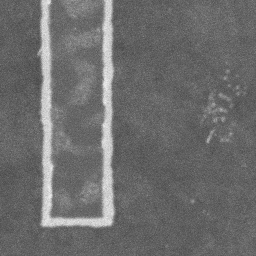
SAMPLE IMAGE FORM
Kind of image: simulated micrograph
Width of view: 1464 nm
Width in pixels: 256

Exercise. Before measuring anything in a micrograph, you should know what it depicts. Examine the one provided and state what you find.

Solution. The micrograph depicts one or a few lines or trenches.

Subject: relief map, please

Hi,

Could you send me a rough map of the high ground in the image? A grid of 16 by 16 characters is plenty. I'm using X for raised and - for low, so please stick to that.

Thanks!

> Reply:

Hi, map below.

---XXXX---------
---XXXX---------
---XXXX---------
---XXXX---------
---XXXX---------
---XXXX---------
---XXXX---------
---XXXX---------
---XXXX---------
---XXXX---------
---XXXX---------
---XXXX---------
---XXXX---------
---XXXX---------
----------------
----------------